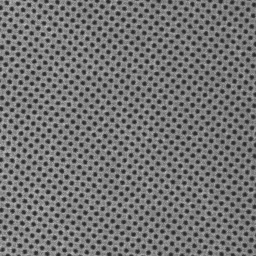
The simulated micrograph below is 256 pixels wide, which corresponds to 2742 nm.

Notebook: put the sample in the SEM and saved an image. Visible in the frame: a regular array of holes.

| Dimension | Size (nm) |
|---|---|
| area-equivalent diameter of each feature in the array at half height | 54.1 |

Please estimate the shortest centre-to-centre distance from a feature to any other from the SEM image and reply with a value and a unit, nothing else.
82.5 nanometres